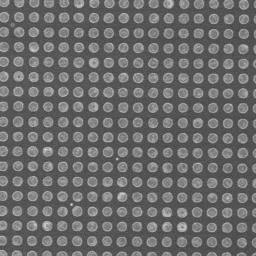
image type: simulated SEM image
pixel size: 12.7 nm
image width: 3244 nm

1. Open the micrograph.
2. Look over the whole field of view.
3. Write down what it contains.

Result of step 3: a regular array of raised bodies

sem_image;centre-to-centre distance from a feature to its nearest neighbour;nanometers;186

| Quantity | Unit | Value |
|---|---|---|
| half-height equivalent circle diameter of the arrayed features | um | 0.12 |